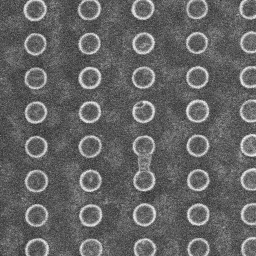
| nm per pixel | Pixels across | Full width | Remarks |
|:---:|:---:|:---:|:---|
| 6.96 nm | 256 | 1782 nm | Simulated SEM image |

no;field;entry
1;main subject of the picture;a regular array of raised bodies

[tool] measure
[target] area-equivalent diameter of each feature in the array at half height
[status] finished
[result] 144 nanometers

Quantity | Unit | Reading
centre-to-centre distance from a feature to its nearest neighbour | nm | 238